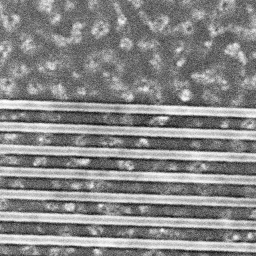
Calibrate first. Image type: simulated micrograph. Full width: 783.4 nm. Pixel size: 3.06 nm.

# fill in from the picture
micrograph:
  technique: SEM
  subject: parallel lines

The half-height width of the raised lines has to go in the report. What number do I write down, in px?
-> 7.48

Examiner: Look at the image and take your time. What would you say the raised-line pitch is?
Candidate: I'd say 0.0685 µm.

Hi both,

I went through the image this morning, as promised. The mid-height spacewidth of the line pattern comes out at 45.8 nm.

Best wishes